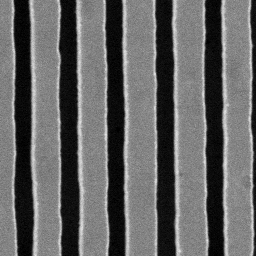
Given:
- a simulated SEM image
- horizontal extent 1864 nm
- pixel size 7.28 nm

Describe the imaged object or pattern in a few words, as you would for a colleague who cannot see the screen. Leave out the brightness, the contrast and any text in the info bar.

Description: lines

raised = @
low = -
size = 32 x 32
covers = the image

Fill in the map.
@@--@@@@--@@@--@@@@---@@@@--@@@-
@@--@@@@--@@@--@@@@---@@@@--@@@-
@@--@@@@--@@@--@@@@---@@@@--@@@-
@@--@@@---@@@--@@@@---@@@@--@@@-
@@--@@@---@@@--@@@@---@@@@--@@@-
@@--@@@---@@@--@@@@---@@@@--@@@@
@@--@@@---@@@--@@@@---@@@@--@@@-
@@--@@@@--@@@--@@@@---@@@@--@@@-
@@--@@@---@@@--@@@@---@@@@--@@@-
@@--@@@---@@@--@@@@---@@@@--@@@@
@@--@@@---@@@--@@@@@--@@@@--@@@-
@@--@@@---@@@--@@@@---@@@@--@@@-
@@--@@@---@@@---@@@---@@@@--@@@-
@@--@@@---@@@---@@@---@@@@--@@@-
@@--@@@---@@@---@@@---@@@@--@@@-
@@--@@@@--@@@---@@@---@@@@--@@@-
@@--@@@---@@@---@@@@--@@@@--@@@-
@@--@@@@--@@@---@@@@--@@@@--@@@@
@@--@@@@--@@@--@@@@@--@@@@--@@@@
@@--@@@@--@@@--@@@@@--@@@@--@@@@
@@--@@@@--@@@--@@@@@--@@@@--@@@@
@@--@@@@--@@@---@@@@--@@@@--@@@@
@@--@@@@--@@@---@@@@--@@@@--@@@@
@@--@@@@--@@@--@@@@@--@@@@--@@@@
@@--@@@@--@@@---@@@@--@@@@--@@@@
@@--@@@@--@@@---@@@---@@@@--@@@@
@@--@@@@--@@@---@@@@--@@@@--@@@@
@@--@@@@--@@@---@@@@--@@@@--@@@@
@@--@@@@--@@@@--@@@@--@@@@--@@@@
@@--@@@@--@@@@--@@@@--@@@@--@@@@
@@--@@@@--@@@@--@@@@--@@@@--@@@@
@@--@@@@--@@@---@@@@--@@@@--@@@@